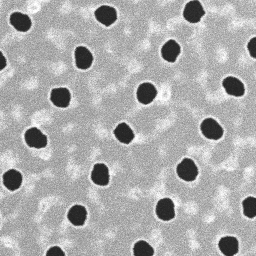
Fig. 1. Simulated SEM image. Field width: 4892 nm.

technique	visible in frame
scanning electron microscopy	a regular array of holes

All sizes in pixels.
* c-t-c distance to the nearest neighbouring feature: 46.6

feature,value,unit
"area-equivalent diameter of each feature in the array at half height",0.411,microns